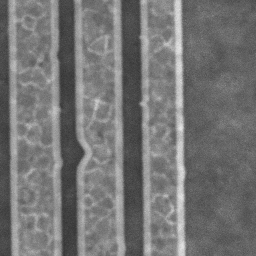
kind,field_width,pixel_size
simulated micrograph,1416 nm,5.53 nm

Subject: one or a few lines or trenches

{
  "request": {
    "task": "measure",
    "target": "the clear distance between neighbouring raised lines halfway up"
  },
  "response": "140 nm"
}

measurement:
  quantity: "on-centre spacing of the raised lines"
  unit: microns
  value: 0.353